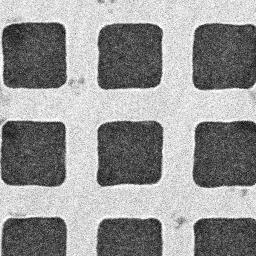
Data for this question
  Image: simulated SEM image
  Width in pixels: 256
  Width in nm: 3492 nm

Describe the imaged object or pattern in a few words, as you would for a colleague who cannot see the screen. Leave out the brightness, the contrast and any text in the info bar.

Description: holes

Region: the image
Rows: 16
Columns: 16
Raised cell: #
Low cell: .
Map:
################
#...###...###..#
....##....##....
....##....##....
....##....##....
#..###...###....
################
################
....##....##....
....##....##....
....##....##....
....##....##....
################
################
....##....##....
....##....##....